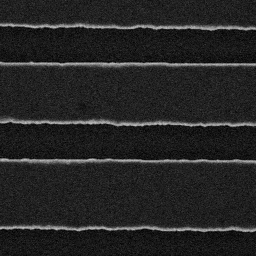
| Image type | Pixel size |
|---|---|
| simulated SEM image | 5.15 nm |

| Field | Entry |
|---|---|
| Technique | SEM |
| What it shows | lines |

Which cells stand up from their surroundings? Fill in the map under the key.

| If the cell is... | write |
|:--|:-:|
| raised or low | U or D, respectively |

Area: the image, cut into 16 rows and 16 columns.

UUUUUUUUUUUUUUUU
UUUUUUUUUUUUUUUU
DDDDDDDDDDDDDDDD
DDDDDDDDDDDDDDDD
UUUUUUUUUUUUUUUU
UUUUUUUUUUUUUUUU
UUUUUUUUUUUUUUUU
UUUUUUUUUUUUUUUU
DDDDDDDDDDDDDDDD
DDDDDDDDDDDDDDDD
UUUUUUUUUUUUUUUU
UUUUUUUUUUUUUUUU
UUUUUUUUUUUUUUUU
UUUUUUUUUUUUUUUU
DDDDDDDDDDDDDDDD
DDDDDDDDDDDDDDDD